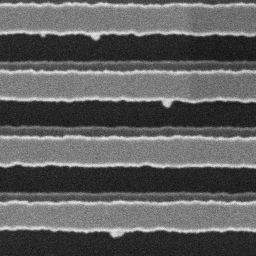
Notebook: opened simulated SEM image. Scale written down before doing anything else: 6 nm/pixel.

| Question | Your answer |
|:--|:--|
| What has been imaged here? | lines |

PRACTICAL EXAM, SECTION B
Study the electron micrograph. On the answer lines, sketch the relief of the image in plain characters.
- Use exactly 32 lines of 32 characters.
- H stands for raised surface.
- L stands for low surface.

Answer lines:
HHHHHHHLHHHLHHLLHLLLLHHHHHLHHHHH
HHHHHHHHHHHHHHHHHHHHHHHHHHHHHHHH
HHHHHHHHHHHHHHHHHHHHHHHHHHHHHHHH
HHHHHHHHHHHHHHHHHHHHHHHHHHHHHHHH
LLLLLLLLLLLHHLLLLLLLLLLLLLLLLLLL
LLLLLLLLLLLLLLLLLLLLLLLLLLLLLLLL
LLLLLLLLLLLLLLLLLLLLLLLLLLLLLLLL
LLLLLLLLLLLLLLLLLLLLLLLLLLLLLLLL
LLLLLLLLLLLLLLLLLLLLLLLLLLLLLLLL
HHHHHHHHHHHHHHHHHHHHHHHHHHHHHHHH
HHHHHHHHHHHHHHHHHHHHHHHHHHHHHHHH
HHHHHHHHHHHHHHHHHHHHHHHHHHHHHHHH
LLHHHHHHHHHLHHHLHHHHHHHHHHHHHHHH
LLLLLLLLLLLLLLLLLLLLLLLLLLLLLLLL
LLLLLLLLLLLLLLLLLLLLLLLLLLLLLLLL
LLLLLLLLLLLLLLLLLLLLLLLLLLLLLLLL
LLLLLLLLLLLLLLLLLLLLLLLLLLLLLLLL
HHHHHHHHHHHHHHHHHHHHHHHHHHHHHHHH
HHHHHHHHHHHHHHHHHHHHHHHHHHHHHHHH
HHHHHHHHHHHHHHHHHHHHHHHHHHHHHHHH
HHHHHHHHHHHHHHHHHHHHHHHHHHHHHHHH
LLLLLLLLLLLLLLLLLLLLLLLLLLLLLLLL
LLLLLLLLLLLLLLLLLLLLLLLLLLLLLLLL
LLLLLLLLLLLLLLLLLLLLLLLLLLLLLLLL
LLLLLLLLLLLLLLLLLLLLLLLLLLLLLLLL
HHHHHHHHHHHHHHHHHHHHHHHHHHHHHHHH
HHHHHHHHHHHHHHHHHHHHHHHHHHHHHHHH
HHHHHHHHHHHHHHHHHHHHHHHHHHHHHHHH
HHHHHHHHHHHHHHHHHHHHHHHHHHHHHHHH
LLLLLLLLLLLLLLHLLLLLLLLLLLLLLLLL
LLLLLLLLLLLLLLLLLLLLLLLLLLLLLLLL
LLLLLLLLLLLLLLLLLLLLLLLLLLLLLLLL